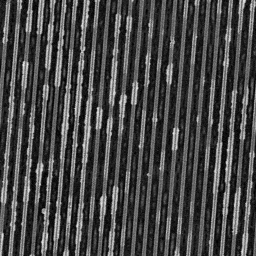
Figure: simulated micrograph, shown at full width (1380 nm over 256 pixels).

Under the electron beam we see parallel lines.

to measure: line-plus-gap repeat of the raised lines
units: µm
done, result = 0.0598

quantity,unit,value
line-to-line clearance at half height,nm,39.6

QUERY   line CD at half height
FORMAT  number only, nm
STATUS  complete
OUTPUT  20.1